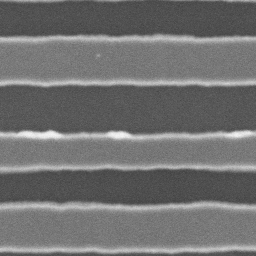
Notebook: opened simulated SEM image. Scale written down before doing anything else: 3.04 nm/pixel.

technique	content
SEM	lines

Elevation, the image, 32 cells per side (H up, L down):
LLLLLLLLLLLLLLLLLLLLLLLLLLLLLLLL
LLLLLLLLLLLLLLLLLLLLLLLLLLLLLLLL
LLLLLLLLLLLLLLLLLLLLLLLLLLLLLLLL
LLLLLLLLLLLLLLLLLLLLLLLLLLLLLLLL
LLLLLLLLLLLLLLLLLLLLLLLLLLLLLLLL
HHHHHHHHHHHHHHHHHHHHHHHHHHHHHHHH
HHHHHHHHHHHHHHHHHHHHHHHHHHHHHHHH
HHHHHHHHHHHHHHHHHHHHHHHHHHHHHHHH
HHHHHHHHHHHHHHHHHHHHHHHHHHHHHHHH
HHHHHHHHHHHHHHHHHHHHHHHHHHHHHHHH
HLLLHHHLLLLLLLLLLHHLLLLLLHHHHHLL
LLLLLLLLLLLLLLLLLLLLLLLLLLLLLLLL
LLLLLLLLLLLLLLLLLLLLLLLLLLLLLLLL
LLLLLLLLLLLLLLLLLLLLLLLLLLLLLLLL
LLLLLLLLLLLLLLLLLLLLLLLLLLLLLLLL
LLLLLLLLLLLLLLLLLLLLLLLLLLLLLLLL
LLLHLLHLLLLLLLHHLLLLLLLLLLLLLHHH
HHHHHHHHHHHHHHHHHHHHHHHHHHHHHHHH
HHHHHHHHHHHHHHHHHHHHHHHHHHHHHHHH
HHHHHHHHHHHHHHHHHHHHHHHHHHHHHHHH
HHHHHHHHHHHHHHHHHHHHHHHHHHHHHHHH
LLLLLLLLLLLLLLLLLLLLLLLLLLLLLLLL
LLLLLLLLLLLLLLLLLLLLLLLLLLLLLLLL
LLLLLLLLLLLLLLLLLLLLLLLLLLLLLLLL
LLLLLLLLLLLLLLLLLLLLLLLLLLLLLLLL
LLLLLLLLLLLLLLLLLLLLLLLLLHHLLLLL
HHHHHHHHHHHHHHHHHHHHHHHHHHHHHHHH
HHHHHHHHHHHHHHHHHHHHHHHHHHHHHHHH
HHHHHHHHHHHHHHHHHHHHHHHHHHHHHHHH
HHHHHHHHHHHHHHHHHHHHHHHHHHHHHHHH
HHHHHHHHHHHHHHHHHHHHHHHHHHHHHHHH
LLLLLLLLLLLLLLLLLLLLLLLLLLLLLLLL